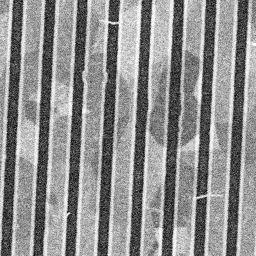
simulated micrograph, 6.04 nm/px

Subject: parallel lines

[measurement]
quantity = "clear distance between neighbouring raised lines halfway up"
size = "86.7 nm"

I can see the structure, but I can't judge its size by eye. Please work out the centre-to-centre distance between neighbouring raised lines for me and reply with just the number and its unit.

194 nm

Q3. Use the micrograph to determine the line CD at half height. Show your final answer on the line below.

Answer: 108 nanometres